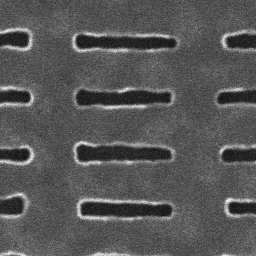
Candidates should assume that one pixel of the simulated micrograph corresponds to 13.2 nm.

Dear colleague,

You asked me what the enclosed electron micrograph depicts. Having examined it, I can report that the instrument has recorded holes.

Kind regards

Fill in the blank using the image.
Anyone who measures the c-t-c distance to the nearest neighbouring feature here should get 55.6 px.